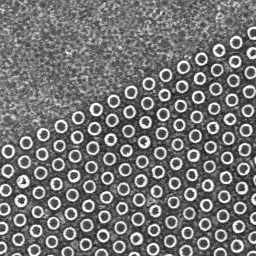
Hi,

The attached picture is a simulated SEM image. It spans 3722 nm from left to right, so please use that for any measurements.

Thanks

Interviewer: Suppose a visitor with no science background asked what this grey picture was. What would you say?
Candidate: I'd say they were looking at a regular array of raised bodies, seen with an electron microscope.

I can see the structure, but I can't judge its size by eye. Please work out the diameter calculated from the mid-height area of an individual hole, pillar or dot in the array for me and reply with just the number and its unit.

165 nm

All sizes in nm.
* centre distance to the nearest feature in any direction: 276